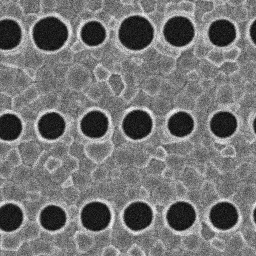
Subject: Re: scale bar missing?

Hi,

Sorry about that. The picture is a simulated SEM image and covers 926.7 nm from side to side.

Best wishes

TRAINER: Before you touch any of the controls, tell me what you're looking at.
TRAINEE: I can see a regular array of holes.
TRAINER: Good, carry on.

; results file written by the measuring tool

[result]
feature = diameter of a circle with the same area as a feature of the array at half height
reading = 29.9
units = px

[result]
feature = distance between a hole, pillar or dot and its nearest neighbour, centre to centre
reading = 155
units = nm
